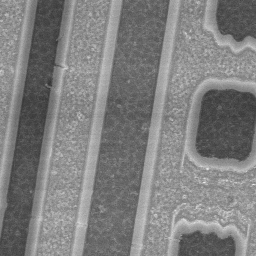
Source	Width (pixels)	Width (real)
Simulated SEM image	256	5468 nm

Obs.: one or a few lines or trenches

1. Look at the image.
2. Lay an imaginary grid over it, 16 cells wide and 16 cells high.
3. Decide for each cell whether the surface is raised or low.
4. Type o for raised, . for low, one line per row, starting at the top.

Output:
oo..ooo....oo...
oo..ooo....oo...
oo..ooo....ooo..
o...ooo...oooooo
o...ooo...oooooo
o..ooo....ooo...
o..ooo....oo....
o..ooo....oo....
o..ooo....oo....
o..ooo...ooo....
...ooo...ooooooo
...ooo...ooooooo
..ooo....ooooooo
..ooo....ooooooo
..ooo....oo...oo
..ooo....oo....o